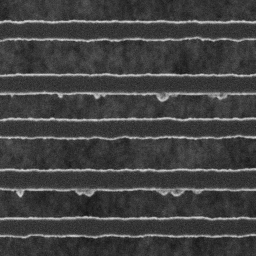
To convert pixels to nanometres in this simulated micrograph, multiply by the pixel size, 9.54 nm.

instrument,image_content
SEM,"lines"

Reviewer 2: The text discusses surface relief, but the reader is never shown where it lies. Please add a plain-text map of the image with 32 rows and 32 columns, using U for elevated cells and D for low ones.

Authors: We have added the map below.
DDDDDDDDDDDDDDDDDDDDDDDDDDDDDDDD
DDDDDDDDDDDDDDDDDDDDDDDDDDDDDDDD
DDDDDDDDDDDDDDDDDDDDDDDDDDDDDDDD
UUUUUUUUUUUUUUUUUUUUUUUUUUUUUUUU
UUUUUUUUUUUUUUUUUUUUUUUUUUUUUUUU
DDDDDDDDDDDDDDDDDDDDDDDDDDDDDDDD
DDDDDDDDDDDDDDDDDDDDDDDDDDDDDDDD
DDDDDDDDDDDDDDDDDDDDDDDDDDDDDDDD
DDDDDDDDDDDDDDDDDDDDDDDDDDDDDDDD
UUUUUUUUUUUUUUUUUUUUUUUUUUUUUUUU
UUUUUUUUUUUUUUUUUUUUUUUUUUUUUUUU
UUUUUUUUUUUUUUUUUUUUUUUUUUUUUUUU
DDDDDDDDDDDDDDDDDDDDDDDDDDDDDDDD
DDDDDDDDDDDDDDDDDDDDDDDDDDDDDDDD
DDDDDDDDDDDDDDDDDDDDDDDDDDDDDDDD
UUUUUUUUUUUUUUUUUUUUUUUUUUUUUUUU
UUUUUUUUUUUUUUUUUUUUUUUUUUUUUUUU
DDDDDDDDDDDDDDDDDDDDDDDDDDDDDDDD
DDDDDDDDDDDDDDDDDDDDDDDDDDDDDDDD
DDDDDDDDDDDDDDDDDDDDDDDDDDDDDDDD
DDDDDDDDDDDDDDDDDDDDDDDDDDDDDDDD
UUUUUUUUUUUUUUUUUUUUUUUUUUUUUUUU
UUUUUUUUUUUUUUUUUUUUUUUUUUUUUUUU
UUUUUUUUUUUUUUUUUUUUUUUUUUUUUUUU
DDDDDDDDDDDDDDDDDDDDDDDDDDDDDDDD
DDDDDDDDDDDDDDDDDDDDDDDDDDDDDDDD
DDDDDDDDDDDDDDDDDDDDDDDDDDDDDDDD
UUUUUUUUUUUUUUUUUUUUUUUUUUUUUUUU
UUUUUUUUUUUUUUUUUUUUUUUUUUUUUUUU
DUUUDDDUUDUUUDDUUUDDDUUUUUUUDUUD
DDDDDDDDDDDDDDDDDDDDDDDDDDDDDDDD
DDDDDDDDDDDDDDDDDDDDDDDDDDDDDDDD